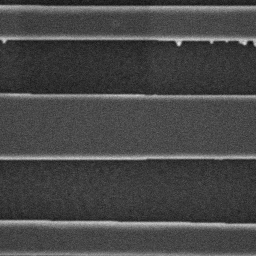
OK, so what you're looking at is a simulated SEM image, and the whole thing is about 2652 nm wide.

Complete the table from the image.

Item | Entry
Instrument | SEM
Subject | lines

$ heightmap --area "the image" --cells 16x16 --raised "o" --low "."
oooooooooooooooo
oooooooooooooooo
..........oooooo
................
................
................
oooooooooooooooo
oooooooooooooooo
oooooooooooooooo
oooooooooooooooo
................
................
................
................
oooooooooooooooo
oooooooooooooooo